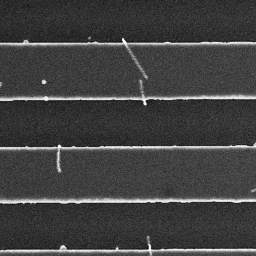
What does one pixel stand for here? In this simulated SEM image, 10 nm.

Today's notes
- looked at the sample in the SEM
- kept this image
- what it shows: lines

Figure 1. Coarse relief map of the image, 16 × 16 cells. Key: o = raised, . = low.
................
................
................
oooooooooooooooo
oooooooooooooooo
oooooooooooooooo
................
................
................
oooooooooooooooo
oooooooooooooooo
oooooooooooooooo
oooooooooooooooo
................
................
................